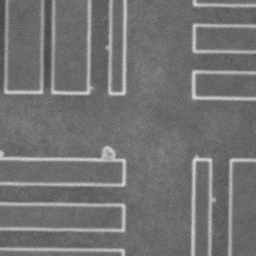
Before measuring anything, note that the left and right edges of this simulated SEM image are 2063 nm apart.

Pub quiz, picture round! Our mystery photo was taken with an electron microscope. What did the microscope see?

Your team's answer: groups of lines, slits or small figures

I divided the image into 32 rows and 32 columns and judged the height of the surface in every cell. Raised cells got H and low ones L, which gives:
LHHHHLLHHHHLLLHHLLLLLLLLLHHHHHHH
LHHHHLLHHHHLLLHHLLLLLLLLLLLLLLLL
LHHHHLLHHHHLLLHHLLLLLLLLLLLLLLLL
LHHHHLLHHHHLLLHHLLLLLLLLHHHHHHHH
LHHHHLLHHHHLLLHHLLLLLLLLHHHHHHHH
LHHHHLLHHHHLLLHHLLLLLLLLHHHHHHHH
LHHHHLLHHHHLLLHHLLLLLLLLLLLHHHHH
LHHHHLLHHHHLLLHHLLLLLLLLLLLLLLLL
LHHHHLLHHHHLLLHHLLLLLLLLLLLLLLLL
LHHHHLLHHHHLLLHHLLLLLLLLHHHHHHHH
LHHHHLLHHHHLLLHLLLLLLLLLHHHHHHHH
LHHHHLLHHHHLLLHLLLLLLLLLHHHHHHHH
LLLLLLLLLLLLLLLLLLLLLLLLLLLLLLLL
LLLLLLLLLLLLLLLLLLLLLLLLLLLLLLLL
LLLLLLLLLLLLLLLLLLLLLLLLLLLLLLLL
LLLLLLLLLLLLLLLLLLLLLLLLLLLLLLLL
LLLLLLLLLLLLLLLLLLLLLLLLLLLLLLLL
LLLLLLLLLLLLLLLLLLLLLLLLLLLLLLLL
LLLLLLLLLLLLLLLLLLLLLLLLLLLLLLLL
LLLLLLLLLLLLLHLLLLLLLLLLLLLLLLLL
HHHHHHHHHHHHHHHLLLLLLLLLHHLLLHHH
HHHHHHHHHHHHHHHLLLLLLLLLHHLLLHHH
HHHHHHHHHHHHHHHLLLLLLLLLHHLLLHHH
LLLLLLLLLLLLLLLLLLLLLLLLHHLLLHHH
LLLLLLLLLLLLLLLLLLLLLLLLHHLLLHHH
HHHHHLLLLLLLLLLLLLLLLLLLHHLLLHHH
HHHHHHHHHHHHHHHLLLLLLLLLHHLLLHHH
HHHHHHHHHHHHHHHLLLLLLLLLHHLLLHHH
HHHHHHHHHHHHHHHLLLLLLLLLHHLLLHHH
LLLLLLLLLLLLLLLLLLLLLLLLHHLLLHHH
LLLLLLLLLLLLLLLLLLLLLLLLHHLLLHHH
HHHHHHHHHHHHHHHLLLLLLLLLHHLLLHHH